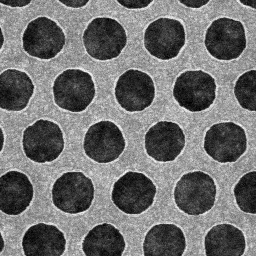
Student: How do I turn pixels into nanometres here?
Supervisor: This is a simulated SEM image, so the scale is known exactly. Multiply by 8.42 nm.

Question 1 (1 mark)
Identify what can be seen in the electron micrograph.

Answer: a regular array of holes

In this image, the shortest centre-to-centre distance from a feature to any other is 499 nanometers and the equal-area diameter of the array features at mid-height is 0.363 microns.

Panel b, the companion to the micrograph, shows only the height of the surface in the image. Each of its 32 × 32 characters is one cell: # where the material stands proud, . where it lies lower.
....####...####....####...####..
################################
####...#####..#####...#####...##
###.....###....###.....###.....#
.##.....##......##.....###.....#
###.....##......##.....###.....#
###....####....####...####....##
############..######.######..###
################################
....###....####....###....####..
....###.....###....###.....##...
....###.....##.....###.....##...
....###.....###....###.....###..
...#####...####...#####...####..
################################
####...#####..#####...#####...##
###.....###....###.....###.....#
.##.....##......##.....##......#
###.....##......##.....##......#
###....####....####...####....##
################################
#..#####..######.#######.######.
....###....####....###.....###..
....##......##......##.....##...
....##......##.....###.....##...
....###....###.....###.....###..
...#####..#####...#####...#####.
################################
####...#####...####...####....##
###.....###....###.....###.....#
.##.....##......##.....###.....#
###.....##.....###.....###.....#